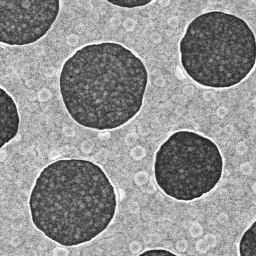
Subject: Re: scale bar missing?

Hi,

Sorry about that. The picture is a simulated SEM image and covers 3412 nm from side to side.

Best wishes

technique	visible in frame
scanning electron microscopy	holes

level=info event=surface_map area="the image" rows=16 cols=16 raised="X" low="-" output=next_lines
----XXXXXXXXXXXX
---XXXXXXXXX---X
--XXXXXXXXX-----
XXXX----XXX-----
XXXX-----XXX----
XXXX-----XXXXXXX
-XXX-----XXXXXXX
-XXXX---XXXXXXXX
-XXXXXXXXXX--XXX
XXXXXXXXXX----XX
XXX---XXXX----XX
XX-----XXX---XXX
XX-----XXXX-XXXX
XX-----XXXXXXXXX
XXX---XXXXXXXXX-
XXXXXXXXXXXXXXX-